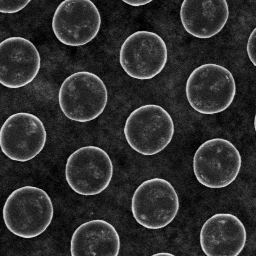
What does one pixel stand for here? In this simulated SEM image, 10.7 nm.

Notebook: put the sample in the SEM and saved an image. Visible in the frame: a regular array of raised bodies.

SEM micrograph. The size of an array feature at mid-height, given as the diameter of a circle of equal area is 516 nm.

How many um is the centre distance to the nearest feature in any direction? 0.788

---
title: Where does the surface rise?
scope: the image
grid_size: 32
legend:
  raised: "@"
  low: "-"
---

@@@-----@@@@----@@-----@@@@@----
@------@@@@@-----------@@@@@@---
-------@@@@@-----------@@@@@----
-------@@@@@-----------@@@@@----
-------@@@@@----@@@@-----@-----@
@@@@----@@------@@@@-----------@
@@@@@----------@@@@@@----------@
@@@@@----------@@@@@@----------@
@@@@@----------@@@@@-----@@@----
@@@@-----@@@-----@@-----@@@@@---
@@@-----@@@@@----------@@@@@@---
-------@@@@@@----------@@@@@@---
-------@@@@@@-----------@@@@@---
--------@@@@@----@@@----@@@@----
--@@----@@@@----@@@@@-----------
-@@@@-----------@@@@@@----------
@@@@@@----------@@@@@@----------
@@@@@@----------@@@@@-----@@----
@@@@@-----@@-----@@@-----@@@@---
-@@@-----@@@@-----------@@@@@@--
--------@@@@@@----------@@@@@@--
--------@@@@@@----------@@@@@@--
--------@@@@@@-----@-----@@@@---
---@@----@@@@----@@@@@----------
-@@@@@-----------@@@@@----------
-@@@@@-----------@@@@@----------
@@@@@@@----------@@@@@----------
-@@@@@-----------@@@@-----@@@@--
-@@@@@----@@@@-----@-----@@@@@@-
---@-----@@@@@@----------@@@@@@-
---------@@@@@@----------@@@@@@-
---------@@@@@@-----------@@@@--